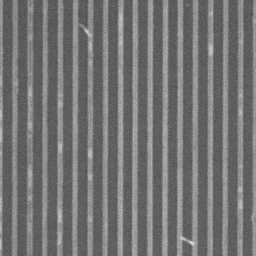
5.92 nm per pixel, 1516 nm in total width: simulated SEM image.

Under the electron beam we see parallel lines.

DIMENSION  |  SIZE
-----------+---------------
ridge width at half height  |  0.0207 micrometres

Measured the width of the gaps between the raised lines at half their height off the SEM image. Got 65.8 nanometers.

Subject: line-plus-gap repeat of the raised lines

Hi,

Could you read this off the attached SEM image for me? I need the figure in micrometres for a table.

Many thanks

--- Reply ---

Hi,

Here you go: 0.0889